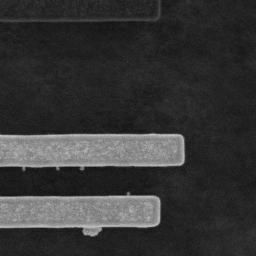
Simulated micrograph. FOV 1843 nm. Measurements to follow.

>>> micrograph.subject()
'wiring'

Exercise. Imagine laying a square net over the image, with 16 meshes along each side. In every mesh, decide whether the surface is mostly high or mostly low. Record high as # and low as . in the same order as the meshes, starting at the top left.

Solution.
##########......
................
................
................
................
................
................
................
###########.....
###########.....
................
................
##########......
##########......
................
................